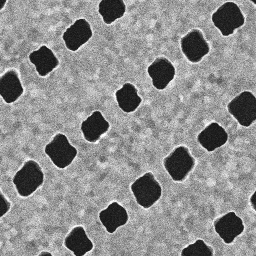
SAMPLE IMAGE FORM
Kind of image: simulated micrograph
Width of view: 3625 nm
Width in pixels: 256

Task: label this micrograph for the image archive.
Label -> a regular array of holes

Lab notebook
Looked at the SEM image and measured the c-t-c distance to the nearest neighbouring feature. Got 600 nanometres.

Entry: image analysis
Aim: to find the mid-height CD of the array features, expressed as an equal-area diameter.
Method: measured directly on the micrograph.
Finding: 388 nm